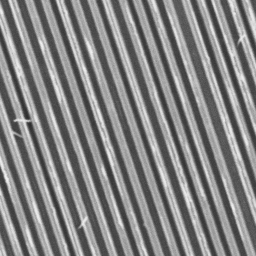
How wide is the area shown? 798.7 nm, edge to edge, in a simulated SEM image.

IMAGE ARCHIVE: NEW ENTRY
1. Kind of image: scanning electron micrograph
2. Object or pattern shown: parallel lines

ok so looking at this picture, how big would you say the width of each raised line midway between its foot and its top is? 0.023 um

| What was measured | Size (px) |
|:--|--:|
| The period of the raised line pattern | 14.9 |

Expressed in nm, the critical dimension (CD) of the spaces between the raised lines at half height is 23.